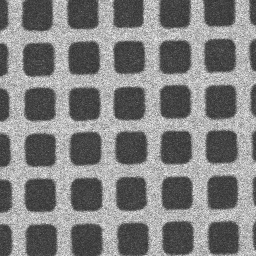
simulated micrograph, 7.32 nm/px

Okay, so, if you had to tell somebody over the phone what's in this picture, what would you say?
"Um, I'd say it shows a regular array of holes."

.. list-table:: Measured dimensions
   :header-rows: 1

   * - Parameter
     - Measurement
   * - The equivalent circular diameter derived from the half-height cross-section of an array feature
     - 258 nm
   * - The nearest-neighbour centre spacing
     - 0.328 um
